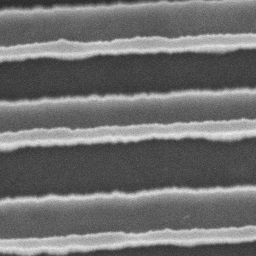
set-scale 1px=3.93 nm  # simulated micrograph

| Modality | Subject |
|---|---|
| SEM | lines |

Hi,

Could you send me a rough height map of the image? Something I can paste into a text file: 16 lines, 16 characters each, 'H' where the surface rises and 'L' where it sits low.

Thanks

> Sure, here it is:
LLLLLHHHHHHHHHHH
HHHHHHHHHHHHHHHH
HHHHHHHHHHHHHHHH
HHLLLLLLLLLLLLLL
LLLLLLLLLLLLLLLL
LLLLLLLLLLLLLLLL
HHHHHHHHHHHHHHHH
HHHHHHHHHHHHHHHH
HHHHHHHHHHHLLLLL
LLLLLLLLLLLLLLLL
LLLLLLLLLLLLLLLL
LLLLLLLLLLLLLLLL
LHHHHHHHHHHHHHHH
HHHHHHHHHHHHHHHH
HHHHHHHHHHHHHHHH
HHHHHLLLLLLLLLLL